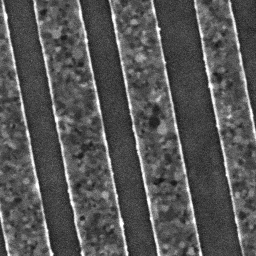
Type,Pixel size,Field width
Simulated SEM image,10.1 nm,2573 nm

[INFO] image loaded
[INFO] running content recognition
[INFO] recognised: one or a few lines or trenches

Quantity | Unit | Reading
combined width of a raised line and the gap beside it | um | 0.755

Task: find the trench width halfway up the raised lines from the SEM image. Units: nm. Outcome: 305